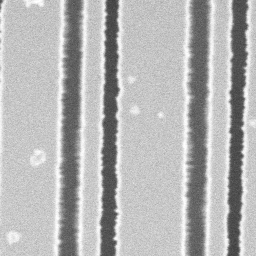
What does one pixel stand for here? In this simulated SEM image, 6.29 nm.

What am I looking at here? lines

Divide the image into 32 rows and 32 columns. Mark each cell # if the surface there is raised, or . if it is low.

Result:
########...##..#########..###..#
########..###..#########..###..#
########..###..#########..###..#
########..###..#########..###..#
########..###..########...###..#
########..###..########...###..#
########..###..########...###..#
########..###..########...###..#
########..###..########...###..#
########..###..########...###..#
########..###..########...###..#
########..###..########...###..#
########..###..########...###..#
########..###..########...###..#
########..###..########...###.##
#######...###..########...###.##
#######...###..########...###.##
#######...###..########...###.##
#######...###..########...###.##
#######...###..########...###.##
#######...###..########...###.##
#######...###..########...###.##
#######...###..########...##..##
#######...###..########...##..##
#######...###..########...##..##
#######...###..########...##..##
#######...###..########...###.##
#######...##...########...##..##
#######...##..#########...##..##
#######...##..#########...##..##
#######...###..########...##..##
#######...##...########...##..##